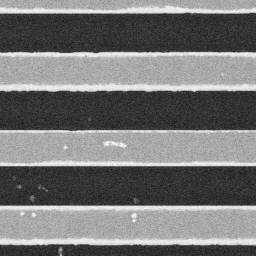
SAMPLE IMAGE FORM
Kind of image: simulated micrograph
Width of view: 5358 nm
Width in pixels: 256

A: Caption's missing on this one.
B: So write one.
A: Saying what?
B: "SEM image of lines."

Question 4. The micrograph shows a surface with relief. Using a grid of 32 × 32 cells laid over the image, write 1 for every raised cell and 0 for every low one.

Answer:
11111111111111111111111111111111
00000001110110110000000001111100
00000000000000000000000000000000
00000000000000000000000000000000
00000000000000000000000000000000
00000000000000000000000000000000
00000000000000000000000000000000
11111111111111111111111111111111
11111111111111111111111111111111
11111111111111111111111111111111
11111111111111111111111111111111
00000000000000000000000000000000
00000000000000000000000000000000
00000000000000000000000000000000
00000000000000000000000000000000
00000000000000000000000000000000
11111111111111111111111111111111
11111111111111111111111111111111
11111111111111111111111111111111
11111111111111111111111111111111
11111111111111111111111111111111
00000000000000000000000000000000
00000000000000000000000000000000
00000000000000000000000000000000
00000000000000000000000000000000
00000000000000000000000000000000
11111111111111111111111111111111
11111111111111111111111111111111
11111111111111111111111111111111
11111111111111111111111111111111
00000000000000000000000000000000
00000000000000000000000000000000